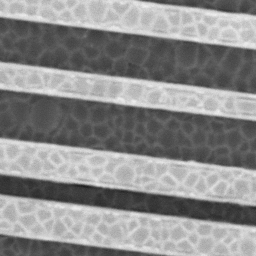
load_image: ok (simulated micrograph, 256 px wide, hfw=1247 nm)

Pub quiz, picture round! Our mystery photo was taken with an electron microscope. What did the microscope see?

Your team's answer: one or a few lines or trenches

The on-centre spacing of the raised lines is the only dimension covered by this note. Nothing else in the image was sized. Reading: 350 nm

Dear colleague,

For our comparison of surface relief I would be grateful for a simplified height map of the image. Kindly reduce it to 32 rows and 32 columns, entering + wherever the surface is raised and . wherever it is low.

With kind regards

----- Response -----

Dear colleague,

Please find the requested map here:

+++++++++++++++++++.............
+++++++++++++++++++++++++++.....
.....+++++++++++++++++++++++++++
.............+++++++++++++++++++
.....................+++++++++++
............................++++
................................
................................
++++............................
++++++++++++....................
++++++++++++++++++++............
....++++++++++++++++++++++++....
.............+++++++++++++++++++
.....................+++++++++++
.............................+++
................................
................................
................................
+++++++++.......................
+++++++++++++++++...............
+++++++++++++++++++++++++.......
++++++++++++++++++++++++++++++++
.......+++++++++++++++++++++++++
...............+++++++++++++++++
.......................+++++++++
++++++++......................++
++++++++++++++++................
++++++++++++++++++++++++........
++++++++++++++++++++++++++++++++
...+++++++++++++++++++++++++++++
............++++++++++++++++++++
...................+++++++++++++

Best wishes